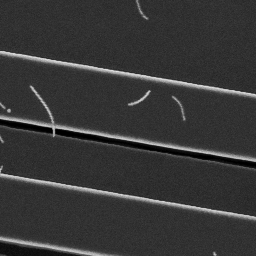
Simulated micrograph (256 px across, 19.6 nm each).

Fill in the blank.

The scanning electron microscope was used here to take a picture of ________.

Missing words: lines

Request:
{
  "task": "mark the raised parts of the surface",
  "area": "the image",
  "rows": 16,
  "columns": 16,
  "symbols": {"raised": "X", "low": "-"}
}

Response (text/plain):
----------------
----------------
----------------
XX--------------
XXXXXXX---------
XXXXXXXXXXXXX---
XXXXXXXXXXXXXXXX
-XXXXXXXXXXXXXXX
-------XXXXXXXXX
------------XXXX
----------------
XXXX------------
XXXXXXXXXX------
XXXXXXXXXXXXXXX-
XXXXXXXXXXXXXXXX
---XXXXXXXXXXXXX